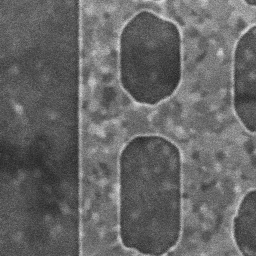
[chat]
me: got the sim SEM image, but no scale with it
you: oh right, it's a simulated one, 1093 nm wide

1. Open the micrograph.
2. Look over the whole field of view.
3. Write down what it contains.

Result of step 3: one or a few lines or trenches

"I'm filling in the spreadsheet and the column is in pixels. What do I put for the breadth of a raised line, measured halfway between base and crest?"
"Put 48.7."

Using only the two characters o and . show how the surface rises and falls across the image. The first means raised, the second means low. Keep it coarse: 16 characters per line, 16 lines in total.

.....ooooooooooo
.....ooo...ooooo
.....oo....oooo.
.....oo....oooo.
.....oo....oooo.
.....ooo...oooo.
.....oooo.ooooo.
.....oooooooooo.
.....oooo.oooooo
.....ooo...ooooo
.....oo....ooooo
.....oo....ooooo
.....oo....oooo.
.....oo....oooo.
.....oo....oooo.
.....ooo...oooo.